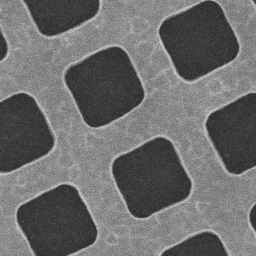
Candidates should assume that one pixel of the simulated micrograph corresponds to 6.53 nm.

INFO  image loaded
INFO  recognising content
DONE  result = holes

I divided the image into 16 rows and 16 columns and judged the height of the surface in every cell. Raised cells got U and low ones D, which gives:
UUDDDDUUUUUUDDUU
UUDDDUUUUUDDDDUU
UUUUUUUUUUDDDDDU
UUUUUUDDUUUDDDDU
UUUUDDDDUUUDDUUU
UUUUDDDDDUUUUUUU
DDUUUDDDDUUUUUDD
DDDUUDDUUUUUUDDD
DDDUUUUUUUUUUDDD
DDDUUUUUDDDUUUDD
DUUUUUUDDDDUUUDD
UUUUUUUDDDDDUUUU
UUDDDUUUDDDUUUUU
UDDDDDUUUUUUUUUU
UDDDDDUUUUUUUUUU
UUDDDUUUUUUDDDUU